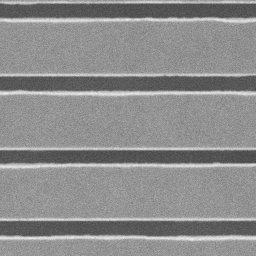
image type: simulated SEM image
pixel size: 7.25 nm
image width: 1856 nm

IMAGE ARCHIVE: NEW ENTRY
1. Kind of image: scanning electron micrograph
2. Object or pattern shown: lines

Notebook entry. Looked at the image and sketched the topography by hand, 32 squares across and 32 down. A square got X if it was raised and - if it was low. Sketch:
--------------------------------
--------------------------------
XXXXXXXXXXXXXXXXXXXXXXXXXXXXX-XX
XXXXXXXXXXXXXXXXXXXXXXXXXXXXXXXX
XXXXXXXXXXXXXXXXXXXXXXXXXXXXXXXX
XXXXXXXXXXXXXXXXXXXXXXXXXXXXXXXX
XXXXXXXXXXXXXXXXXXXXXXXXXXXXXXXX
XXXXXXXXXXXXXXXXXXXXXXXXXXXXXXXX
XXXXXXXXXXXXXXXXXXXXXXXXXXXXXXXX
--------------------------------
--------------------------------
-XXX---------------------XXXX---
XXXXXXXXXXXXXXXXXXXXXXXXXXXXXXXX
XXXXXXXXXXXXXXXXXXXXXXXXXXXXXXXX
XXXXXXXXXXXXXXXXXXXXXXXXXXXXXXXX
XXXXXXXXXXXXXXXXXXXXXXXXXXXXXXXX
XXXXXXXXXXXXXXXXXXXXXXXXXXXXXXXX
XXXXXXXXXXXXXXXXXXXXXXXXXXXXXXXX
XXXXXXXXXXXXXXXXXXXXXXXXXXXXXXXX
--------------------------------
---------------------------X---X
XXXXXXXXXXXXXXXXXXXXXXXXXXXXXXXX
XXXXXXXXXXXXXXXXXXXXXXXXXXXXXXXX
XXXXXXXXXXXXXXXXXXXXXXXXXXXXXXXX
XXXXXXXXXXXXXXXXXXXXXXXXXXXXXXXX
XXXXXXXXXXXXXXXXXXXXXXXXXXXXXXXX
XXXXXXXXXXXXXXXXXXXXXXXXXXXXXXXX
XXXXXXXXXXXXXXXXXXXXXX-----XXXX-
--------------------------------
--------------------------------
XXXXXXXXXXXXXXXXXXXXXXXXXXXXXXXX
XXXXXXXXXXXXXXXXXXXXXXXXXXXXXXXX